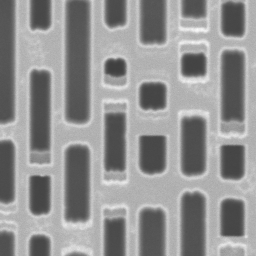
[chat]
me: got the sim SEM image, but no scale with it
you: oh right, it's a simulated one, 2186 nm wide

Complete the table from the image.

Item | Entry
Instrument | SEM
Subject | parallel lines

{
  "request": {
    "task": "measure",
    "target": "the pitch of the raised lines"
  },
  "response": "324 nm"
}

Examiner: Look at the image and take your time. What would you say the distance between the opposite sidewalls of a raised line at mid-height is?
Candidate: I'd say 0.148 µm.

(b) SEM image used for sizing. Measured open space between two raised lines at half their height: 180 nanometers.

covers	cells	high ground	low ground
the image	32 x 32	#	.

..##..##...##...##...##...##..##
..##..##...##...##...##...##..##
..##..##...##...##...#######..##
..##..##...#######...#######..##
..######...#######...########.##
..######...#######.#############
..######...#################..##
..######...############...##..##
..######...##...#######...##..##
..##..##...###.#############..##
..##..##...#######..########..##
..##..##...######....#######..##
..##..##...######....#######..##
..##..##...#######..########..##
..##..##...##...############..##
####..#######...#######...######
####..#######...#######...######
####..#######...#....##...######
..##..###..##...#....##...##..##
..######...##...#....##...##..##
..######...##...##...##...##..##
..######...#######..###..###..##
..##..##...#####################
..##..##...#####################
..##..##...############..#######
####..##...############...##..##
####..##...#######..###...##..##
#########..###.##....##...##..##
#############...#....##...##..##
..###########...#....##...##..##
..##..#######...#....##...######
..##..#######...#....##...######